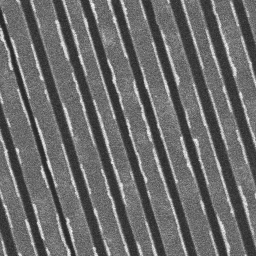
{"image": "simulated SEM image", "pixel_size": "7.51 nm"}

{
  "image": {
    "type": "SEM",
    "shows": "parallel lines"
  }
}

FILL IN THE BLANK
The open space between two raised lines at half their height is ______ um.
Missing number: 0.0674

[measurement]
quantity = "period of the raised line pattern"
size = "216 nm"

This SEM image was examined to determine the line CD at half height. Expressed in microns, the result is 0.155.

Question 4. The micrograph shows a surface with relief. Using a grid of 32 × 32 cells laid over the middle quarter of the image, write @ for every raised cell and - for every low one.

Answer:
@@--@@@@@--@@@@@@--@@@@@---@@@@-
@@---@@@@---@@@@@--@@@@@---@@@@@
@@@--@@@@---@@@@@---@@@@@--@@@@@
@@@--@@@@@--@@@@@@--@@@@@--@@@@@
@@@---@@@@--@@@@@@--@@@@@@--@@@@
@@@@--@@@@---@@@@@--@@@@@@--@@@@
@@@@--@@@@@--@@@@@---@@@@@--@@@@
@@@@---@@@@--@@@@@@--@@@@@@--@@@
@@@@---@@@@@--@@@@@--@@@@@@--@@@
@@@@@--@@@@@--@@@@@---@@@@@--@@@
@@@@@---@@@@--@@@@@@--@@@@@---@@
@@@@@---@@@@---@@@@@--@@@@@@--@@
@@@@@@--@@@@@--@@@@@---@@@@@--@@
@@@@@@---@@@@--@@@@@@--@@@@@---@
-@@@@@---@@@@---@@@@@--@@@@@@--@
-@@@@@@--@@@@---@@@@@--@@@@@@--@
-@@@@@@--@@@@@--@@@@@@--@@@@@--@
--@@@@@---@@@@--@@@@@@--@@@@@---
--@@@@@@--@@@@---@@@@@--@@@@@@--
--@@@@@@--@@@@@--@@@@@---@@@@@--
--@@@@@@--@@@@@--@@@@@@--@@@@@--
---@@@@@---@@@@---@@@@@--@@@@@@-
---@@@@@@--@@@@@--@@@@@---@@@@@-
@--@@@@@@--@@@@@--@@@@@@--@@@@@-
@---@@@@@---@@@@---@@@@@--@@@@@-
@---@@@@@@--@@@@@--@@@@@---@@@@@
@@--@@@@@@--@@@@@--@@@@@@--@@@@@
@@---@@@@@---@@@@--@@@@@@--@@@@@
@@---@@@@@@--@@@@@--@@@@@---@@@@
@@@--@@@@@@--@@@@@--@@@@@---@@@@
@@@---@@@@@---@@@@--@@@@@@--@@@@
@@@---@@@@@---@@@@@--@@@@@--@@@@